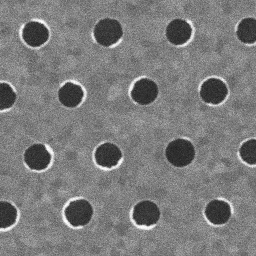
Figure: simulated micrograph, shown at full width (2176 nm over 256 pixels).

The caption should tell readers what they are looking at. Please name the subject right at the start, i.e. a regular array of holes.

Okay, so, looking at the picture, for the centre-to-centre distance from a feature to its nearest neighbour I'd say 0.589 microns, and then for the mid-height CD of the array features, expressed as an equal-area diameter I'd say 0.231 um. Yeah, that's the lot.